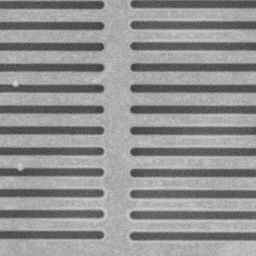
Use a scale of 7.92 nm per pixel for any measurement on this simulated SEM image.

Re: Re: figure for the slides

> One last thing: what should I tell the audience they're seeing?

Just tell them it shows groups of lines, slits or small figures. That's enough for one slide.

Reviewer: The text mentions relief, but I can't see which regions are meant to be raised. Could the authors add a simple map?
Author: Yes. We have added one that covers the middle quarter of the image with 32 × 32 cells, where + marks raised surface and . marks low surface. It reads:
..........+++++++...............
..........+++++++...............
++++++++++++++++++++++++++++++++
++++++++++++++++++++++++++++++++
++++++++++++++++++++++++++++++++
..........+++++++...............
..........+++++++...............
++++++++++++++++++++++++++++++++
++++++++++++++++++++++++++++++++
++++++++++++++++++++++++++++++++
.........++++++++...............
..........++++++................
.........+++++++++..............
++++++++++++++++++++++++++++++++
++++++++++++++++++++++++++++++++
.........+++++++++..............
..........++++++................
..........+++++++...............
++++++++++++++++++++++++++++++++
++++++++++++++++++++++++++++++++
.........+++++++++++++++++++....
..........++++++................
..........++++++................
+++++++++++++++++++++++++++++++.
++++++++++++++++++++++++++++++++
++++++++++++++++++++++++++++++++
..........+++++++...............
..........++++++................
++.......+++++++++..............
++++++++++++++++++++++++++++++++
++++++++++++++++++++++++++++++++
..........+++++++...............